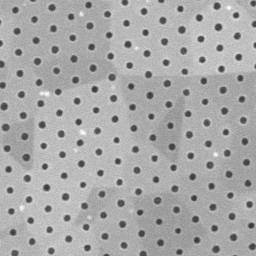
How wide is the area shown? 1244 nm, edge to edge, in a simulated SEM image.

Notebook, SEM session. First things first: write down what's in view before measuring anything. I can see a regular array of holes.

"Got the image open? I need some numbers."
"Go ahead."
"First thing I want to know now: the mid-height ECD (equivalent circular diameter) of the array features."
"7.65 pixels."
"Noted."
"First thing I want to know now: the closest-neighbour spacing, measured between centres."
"102 nm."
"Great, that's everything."